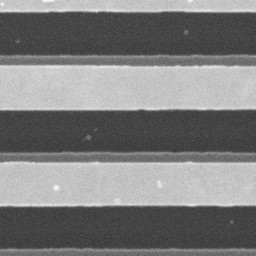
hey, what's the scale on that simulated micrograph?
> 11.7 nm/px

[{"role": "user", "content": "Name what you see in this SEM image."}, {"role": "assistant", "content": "lines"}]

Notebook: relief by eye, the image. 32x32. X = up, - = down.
XXXXXXXXXXXXXXXXXXXXXXXXXXXXXXXX
--------------------------------
--------------------------------
--------------------------------
--------------------------------
--------------------------------
--------------------------------
XXXXXXXXXXXXXXXXXXXXXXXXXXXXXXXX
XXXXXXXXXXXXXXXXXXXXXXXXXXXXXXXX
XXXXXXXXXXXXXXXXXXXXXXXXXXXXXXXX
XXXXXXXXXXXXXXXXXXXXXXXXXXXXXXXX
XXXXXXXXXXXXXXXXXXXXXXXXXXXXXXXX
XXXXXXXXXXXXXXXXXXXXXXXXXXXXXXXX
XXXXXXXXXXXXXXXXXXXXXXXXXXXXXXXX
--------------------------------
--------------------------------
--------------------------------
--------------------------------
--------------------------------
XXXXXXXXXXXXXXXXXXXXXXXXXXXXXXXX
XXXXXXXXXXXXXXXXXXXXXXXXXXXXXXXX
XXXXXXXXXXXXXXXXXXXXXXXXXXXXXXXX
XXXXXXXXXXXXXXXXXXXXXXXXXXXXXXXX
XXXXXXXXXXXXXXXXXXXXXXXXXXXXXXXX
XXXXXXXXXXXXXXXXXXXXXXXXXXXXXXXX
XXXXXXXXXXXXXXXXXXXXXXXXXXXXXXXX
--------------------------------
--------------------------------
--------------------------------
--------------------------------
--------------------------------
XXXXXXXXXXXXXXXXXXXXXXXXXXXXXXXX